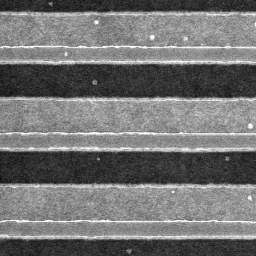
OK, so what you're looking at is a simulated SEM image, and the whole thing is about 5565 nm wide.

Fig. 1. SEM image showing lines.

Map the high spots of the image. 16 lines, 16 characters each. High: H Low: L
LLLLLLLLLLLLLLLL
HHHHHHHHHHHHHHHH
HHHHHHHHHHHHHHHH
HHHHHHHHHHHHHHHH
LLLLLLLLLLLLLLLL
LLLLLLLLLLLLLLLL
HHHHHHHHHHHHHHHH
HHHHHHHHHHHHHHHH
HHHHHHHHHHHHHHHH
LLLLLLLLLLLLLLLL
LLLLLLLLLLLLLLLL
LLLLLLLLLLLLLLLL
HHHHHHHHHHHHHHHH
HHHHHHHHHHHHHHHH
HHHHHHHHHHHHHHHH
LLLLLLLLLLLLLLLL